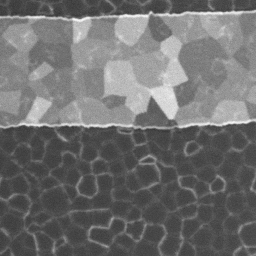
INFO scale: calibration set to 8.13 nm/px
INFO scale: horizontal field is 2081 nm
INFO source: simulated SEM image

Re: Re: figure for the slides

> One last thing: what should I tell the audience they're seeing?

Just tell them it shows one or a few lines or trenches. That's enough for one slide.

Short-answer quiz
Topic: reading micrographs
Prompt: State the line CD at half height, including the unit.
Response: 889 nm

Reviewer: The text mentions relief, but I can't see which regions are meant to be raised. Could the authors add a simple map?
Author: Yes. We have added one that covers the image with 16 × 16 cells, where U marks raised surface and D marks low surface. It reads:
DDDDDDDDDDDDDDDD
UUUUUUUUUUUUUUUU
UUUUUUUUUUUUUUUU
UUUUUUUUUUUUUUUU
UUUUUUUUUUUUUUUU
UUUUUUUUUUUUUUUU
UUUUUUUUUUUUUUUU
UUUUUUUUUUUUUUUU
DDDDDDDDDDDDDDDD
DDDDDDDDDDDDDDDD
DDDDDDDDDDDDDDDD
DDDDDDDDDDDDDDDD
DDDUDDDDDDDDDDDD
DDDDDDDDDDDDDDDD
DDDDDDDDDDDDDDDD
DDDDDDDDDDDDDDDD